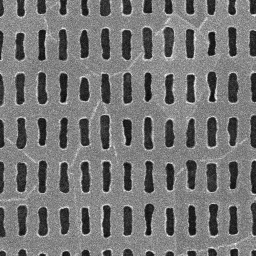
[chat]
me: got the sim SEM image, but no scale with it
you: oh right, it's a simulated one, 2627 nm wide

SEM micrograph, a regular array of holes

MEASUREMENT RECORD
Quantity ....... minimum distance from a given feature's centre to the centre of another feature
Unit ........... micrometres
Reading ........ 0.215